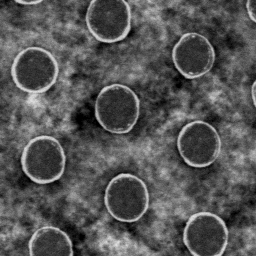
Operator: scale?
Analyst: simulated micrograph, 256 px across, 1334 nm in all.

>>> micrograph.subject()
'raised bodies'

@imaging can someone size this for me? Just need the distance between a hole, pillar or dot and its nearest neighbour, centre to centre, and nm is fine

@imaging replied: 463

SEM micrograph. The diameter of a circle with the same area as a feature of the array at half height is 228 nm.